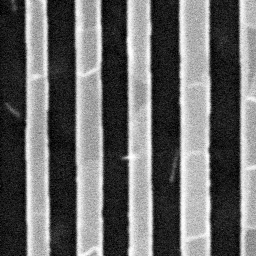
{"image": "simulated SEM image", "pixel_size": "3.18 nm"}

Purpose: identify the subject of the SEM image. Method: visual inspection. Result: lines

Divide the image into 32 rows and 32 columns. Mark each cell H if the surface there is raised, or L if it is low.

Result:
LLLHHHLLLLHHLLLLHHHLLLLHHHLLLLHH
LLLLHHLLLLHHLLLLHHHLLLLHHHLLLLHH
LLLLHHLLLLHHLLLLHHHLLLLHHHLLLLHH
LLLLHHLLLLHHLLLLHHHLLLLHHHLLLLHH
LLLHHHLLLLHHLLLLHHHLLLLHHHLLLLHH
LLLLHHLLLLHHLLLLHHHLLLLHHHLLLLHH
LLLLHHLLLLHHLLLLHHHLLLLHHHLLLLHH
LLLLHHLLLLHHLLLLHHHLLLLHHHLLLLHH
LLLLHHLLLLHHLLLLHHHLLLLHHHLLLLHH
LLLLHHLLLLHHLLLLHHHLLLLHHHLLLLHH
LLLLHHLLLLHHHLLLHHHLLLLHHHLLLLHH
LLLLHHLLLLHHHLLLHHHLLLLHHHLLLLHH
LLLLHHLLLLHHHLLLHHHLLLLHHHLLLLHH
LLLLHHLLLLHHHLLLHHHLLLLHHHLLLLHH
LLLLHHLLLLHHHLLLHHHLLLLHHHLLLLHH
LLLLHHLLLLHHHLLLHHHLLLLHHHLLLLHH
LLLHHHLLLLHHHLLLHHHLLLLHHHLLLLHH
LLLHHHLLLLHHHLLLHHHLLLLHHHLLLLHH
LLLHHHLLLLHHHLLLHHHLLLLHHHLLLLHH
LLLHHHLLLLHHHLLLHHHLLLLHHHLLLLHH
LLLHHHLLLLHHHLLLHHHLLLLHHHLLLLHH
LLLLHHLLLLHHHLLLHHHLLLLHHHLLLLHH
LLLLHHLLLLHHHLLLHHHLLLLHHHLLLLHH
LLLLHHLLLLHHHLLLHHHLLLLHHHLLLLHH
LLLLHHLLLLHHHLLLHHHLLLLHHHLLLLHH
LLLLHHLLLLHHHLLLHHHLLLLHHHLLLLHH
LLLLHHLLLLHHHLLLHHHLLLLHHHLLLLHH
LLLLHHLLLLHHHLLLHHHLLLLHHHLLLLHH
LLLLHHLLLLHHHLLLHHHLLLLHHHLLLLHH
LLLLHHLLLLHHHLLLHHHLLLLHHHLLLLHH
LLLLHHLLLLHHHLLLHHHLLLLHHHLLLLHH
LLLLHHLLLLHHHLLLHHHLLLLHHHLLLLHH